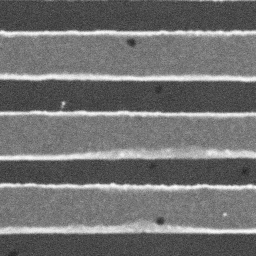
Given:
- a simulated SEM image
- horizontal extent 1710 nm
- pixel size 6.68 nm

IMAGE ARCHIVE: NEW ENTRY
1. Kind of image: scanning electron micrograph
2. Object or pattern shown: lines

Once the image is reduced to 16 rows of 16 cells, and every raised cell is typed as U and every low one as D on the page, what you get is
DDDDDDDDDDDDDDDD
DDDDDDDDDDDDDDDD
UUUUUUUUUUUUUUUU
UUUUUUUUUUUUUUUU
UUUUUUUUUUUUUUUU
DDDDDDDDDDDDDDDD
DDDDDDDDDDDDDDDD
UUUUUUUUUUUUUUUU
UUUUUUUUUUUUUUUU
UUUUUUUUUUUUUUUU
DDDDDDDDDDDDDDDD
DDDDDDDDDDDDDDDD
UUUUUUUUUUUUUUUU
UUUUUUUUUUUUUUUU
DDDDDDDDDDDDDDDD
DDDDDDDDDDDDDDDD